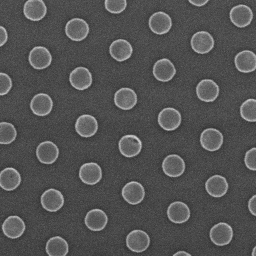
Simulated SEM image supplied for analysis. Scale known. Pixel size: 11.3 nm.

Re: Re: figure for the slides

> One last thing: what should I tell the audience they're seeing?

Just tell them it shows a regular array of raised bodies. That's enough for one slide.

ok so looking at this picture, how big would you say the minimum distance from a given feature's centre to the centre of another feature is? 527 nanometers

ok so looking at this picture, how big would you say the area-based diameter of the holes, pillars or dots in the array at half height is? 248 nm